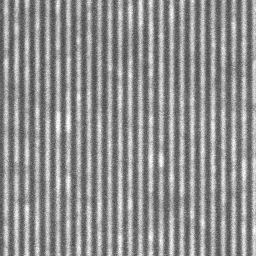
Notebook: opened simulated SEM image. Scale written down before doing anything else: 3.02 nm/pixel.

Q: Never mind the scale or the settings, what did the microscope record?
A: parallel lines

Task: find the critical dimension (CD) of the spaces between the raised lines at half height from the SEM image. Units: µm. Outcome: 0.0208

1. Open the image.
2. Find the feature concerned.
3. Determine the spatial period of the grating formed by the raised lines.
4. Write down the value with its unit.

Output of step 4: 0.0313 micrometres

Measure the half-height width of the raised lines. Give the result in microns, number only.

0.0102